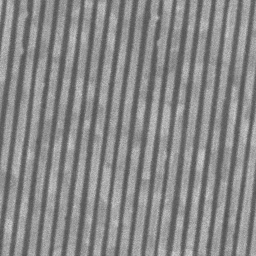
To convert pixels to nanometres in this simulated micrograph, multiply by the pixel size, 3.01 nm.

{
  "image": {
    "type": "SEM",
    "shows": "parallel lines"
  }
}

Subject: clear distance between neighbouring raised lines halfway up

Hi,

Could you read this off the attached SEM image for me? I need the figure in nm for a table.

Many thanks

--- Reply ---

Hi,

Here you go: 17.9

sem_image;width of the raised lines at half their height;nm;20.5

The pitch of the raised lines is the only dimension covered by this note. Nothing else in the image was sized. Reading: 13 px